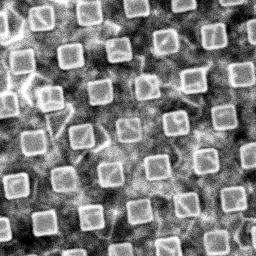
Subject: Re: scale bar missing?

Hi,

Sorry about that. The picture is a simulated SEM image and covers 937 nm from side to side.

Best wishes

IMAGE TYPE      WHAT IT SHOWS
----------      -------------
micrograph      a regular array of raised bodies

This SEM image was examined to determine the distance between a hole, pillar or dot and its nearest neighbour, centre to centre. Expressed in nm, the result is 171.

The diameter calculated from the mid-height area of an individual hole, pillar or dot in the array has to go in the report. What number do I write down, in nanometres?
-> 93.5